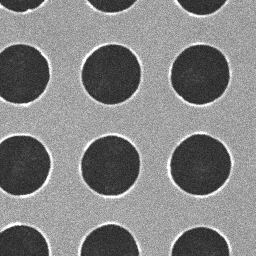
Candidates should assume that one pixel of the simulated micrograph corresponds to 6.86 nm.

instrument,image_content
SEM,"holes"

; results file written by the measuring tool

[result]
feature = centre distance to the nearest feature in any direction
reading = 613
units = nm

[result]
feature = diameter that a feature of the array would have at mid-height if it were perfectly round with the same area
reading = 414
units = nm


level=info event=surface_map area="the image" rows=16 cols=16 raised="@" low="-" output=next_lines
--@@@@--@@@---@@
@@@@@@@@@@@@@@@@
@@@@@@@@@@@@@@@@
---@@@--@@@---@@
---@@----@@---@@
---@@----@@---@@
@@@@@@@@@@@@-@@@
@@@@@@@@@@@@@@@@
@-@@@@@@@@@@-@@@
---@@----@@---@@
---@@----@@---@@
---@@---@@@---@@
@@@@@@@@@@@@@@@@
@@@@@@@@@@@@@@@@
--@@@@--@@@@--@@
---@@----@@---@@